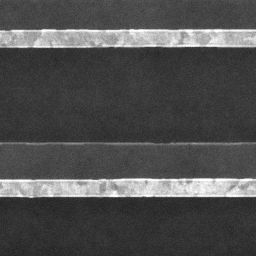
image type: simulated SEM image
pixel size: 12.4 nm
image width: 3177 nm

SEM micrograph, lines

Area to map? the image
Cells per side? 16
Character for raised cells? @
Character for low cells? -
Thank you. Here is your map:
@@@@@@@@@@@@@@@@
@@@@@@@@@@@@@@@@
@@@@@@@@@@@@@@@@
----------------
----------------
----------------
----------------
----------------
----------------
@@@@@@@@@@@@@@@@
@@@@@@@@@@@@@@@@
@@@@@@@@@@@@@@@@
----------------
----------------
----------------
----------------